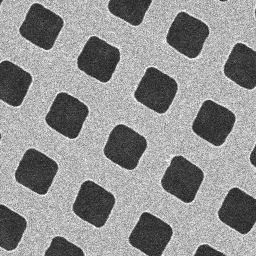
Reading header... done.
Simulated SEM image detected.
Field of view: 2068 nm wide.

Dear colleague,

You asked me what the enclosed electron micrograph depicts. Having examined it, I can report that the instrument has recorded a regular array of holes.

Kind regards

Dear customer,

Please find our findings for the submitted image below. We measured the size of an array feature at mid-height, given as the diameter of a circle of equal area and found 336 nm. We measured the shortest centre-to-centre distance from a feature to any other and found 520 nanometres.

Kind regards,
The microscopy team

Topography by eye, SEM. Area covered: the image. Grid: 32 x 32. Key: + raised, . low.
++++.+++++++++.....+++++++++++++
+++....+++++++....++++++++++++++
+++.....+++++++...++++...+++++++
++......+++++++++++++.....++++++
+++....++++++++++++++.....++++++
++++...++++...+++++++....+++++++
++++++++++.....+++++++...++++...
++++++++++.....+++++++++++++....
...+++++++....++++++++++++++....
....+++++++...++++...+++++++....
....+++++++++++++.....++++++++..
...++++++++++++++.....++++++++++
...++++...+++++++.....++++++++++
++++++.....++++++++..++++...++++
++++++.....++++++++++++++....+++
++++++....++++++++++++++.....+++
+++++++...++++...+++++++.....+++
+++++++++++++.....++++++++..++++
+++++++++++++.....++++++++++++++
+++...+++++++.....++++.++++++++.
++.....++++++++..++++...++++++++
++.....++++++++++++++....+++++++
++.....+++++++++++++.....+++++++
+++...++++...+++++++.....++++.++
++++++++++....++++++++..++++...+
+++++++++.....++++++++++++++....
..+++++++.....+++++++++++++.....
...+++++++...++++...++++++++....
...++++++++++++++....++++++++...
...+++++++++++++.....+++++++++++
..++++...+++++++.....+++++++++++
++++++....++++++++..++++....++++